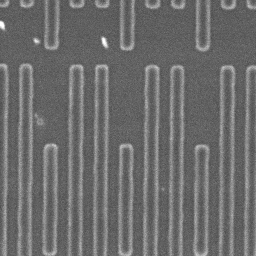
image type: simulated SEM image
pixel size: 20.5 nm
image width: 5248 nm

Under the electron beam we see wiring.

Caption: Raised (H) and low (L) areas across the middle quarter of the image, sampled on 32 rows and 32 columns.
LLHHLLLLLHLLLLLLLLLLLLLLLLLLLLLL
LLHHHLLLHHHLLLLLLLLLLHHHLLLHHHLL
LLHHHLLLHHHLLLLLLLLLLHHHLLLHHHLL
LLHHHLLLHHHLLLLLLLLLLHHHLLLHHHLL
LLHHHLLLHHHLLLLLLLLLLHHLLLLHHHLL
LLHHHLLLHHHLLLLLLLLLLHHLLLLHHHLL
LLHHHLLLHHHLLLLLLLLLLHHLLLLHHHLL
LLHHHLLLHHHLLLLLLLLLLHHLLLLHHHLL
LLHHLLLLHHHLLLLLLLLLLHHLLLLHHHLL
LLHHLLLLHHHLLLLLLLLLLHHLLLLHHHLL
LLHHLLLLHHHLLLLLLLLLLHHLLLLHHHLL
LLHHLLLLHHHLLLLLLLLLLHHLLLLHHHLL
LLHHLLLLHHHLLLLLLLLLLHHLLLLHHHLL
LLHHLLLLHHHLLLLLLLLLLHHLLLLHHHLL
LLHHLLLLHHHLLLLLLLLLLHHLLLLHHHLL
LLHHLLLLHHHLLLLLLLLLLHHLLLLHHHLL
LLHHLLLLHHHLLLLLLLLLLHHLLLLHHHLL
LLHHLLLLHHHLLLLLLLLLLHHLLLLHHHLL
LLHHLLLLHHHLLLLLLLLLLHHLLLLHHHLL
LLHHLLLLHHHLLLLLLLLLLHHLLLLHHHLL
LLHHLLLLHHHLLLLHLLLLLHHLLLLHHHLL
LLHHLLLLHHHLLLHHHLLLLHHLLLLHHLLL
LLHHLLLLHHHLLLHHHLLLHHHLLLLHHLLL
LLHHLLLLHHHLLLHHHLLLHHHLLLLHHHLL
LLHHLLLLHHHLLLHHHLLLHHHLLLLHHLLL
LLHHLLLLHHHLLLHHHLLLLHHLLLLHHLLL
LLHHLLLLHHHLLLHHHLLLLHHLLLLHHLLL
LLHHLLLLHHHLLLHHHLLLHHHLLLLHHLLL
LLHHLLLLHHHLLLHHHLLLHHHLLLLHHLLL
LLHHLLLLHHHLLLHHHLLLHHHLLLLHHLLL
LLHHLLLLHHHLLLHHHLLLHHHLLLLHHLLL
LLHHLLLLHHLLLLHHHLLLHHHLLLLHHLLL